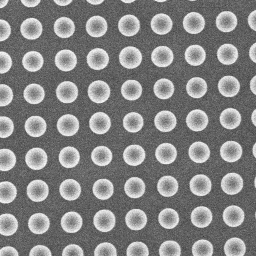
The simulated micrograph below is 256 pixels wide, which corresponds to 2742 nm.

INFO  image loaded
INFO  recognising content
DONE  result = an array of small figures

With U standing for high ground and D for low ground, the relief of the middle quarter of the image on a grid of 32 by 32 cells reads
UUUDDDUUUUDDDDDUUUDDDDDUUUDDDDDD
UUDDDDDDDDDDDDDDDDDDDDDDDDDDDDDD
DDDDDDDDDDDDDDDDDDDDDDDDDDDDDDDD
DDDDDDDDDDDDDDDDDDDDDDDDDDDDDDDD
UDDDDDDUUUDDDDDUUUDDDDDUUUUDDDDU
UUUDDDUUUUUDDDUUUUUDDDDUUUUDDDDU
UUUDDDUUUUUDDDUUUUUDDDDUUUUDDDDU
UUUDDDUUUUUDDDDUUUUDDDDUUUUDDDDU
UUUDDDDUUUUDDDDUUUDDDDDDUUDDDDDD
UUDDDDDDUUDDDDDDDDDDDDDDDDDDDDDD
DDDDDDDDDDDDDDDDDDDDDDDDDDDDDDDD
DDDDDDDDDDDDDDDDDDDDDDDDDDDDDDDD
DDDDDDDDUUDDDDDDUUUDDDDUUUUDDDDU
UUUDDDDUUUUDDDDUUUUUDDDUUUUUDDDU
UUUUDDUUUUUUDDDUUUUUDDDUUUUUDDDU
UUUUDDUUUUUUDDDUUUUUDDDUUUUUDDDU
UUUDDDDUUUUDDDDDUUUDDDDDUUUDDDDD
UUUDDDDDDDDDDDDDDDDDDDDDDDDDDDDD
DDDDDDDDDDDDDDDDDDDDDDDDDDDDDDDD
DDDDDDDDDDDDDDDDDDDDDDDDDDDDDDDD
DDDDDDDDDDDDDDDDUUUDDDDDUUUDDDDD
UUUDDDDUUUUDDDDUUUUUDDDUUUUUDDDU
UUUUDDDUUUUUDDDUUUUUDDDUUUUUDDDU
UUUUDDDUUUUUDDDUUUUUDDDUUUUUDDDD
UUUDDDDUUUUDDDDUUUUUDDDDUUUDDDDD
UUUDDDDDDDDDDDDDDDDDDDDDDDDDDDDD
DDDDDDDDDDDDDDDDDDDDDDDDDDDDDDDD
DDDDDDDDDDDDDDDDDDDDDDDDDDDDDDDD
DDDDDDDDDDDDDDDDDUUDDDDDUUUUDDDD
UUUDDDDDUUUUDDDDUUUUDDDDUUUUDDDD
UUUUDDDUUUUUDDDUUUUUDDDUUUUUDDDD
UUUUDDDUUUUUDDDUUUUUDDDUUUUUDDDD